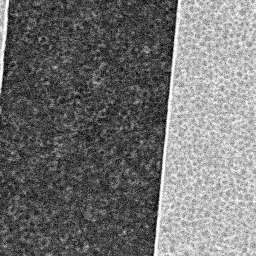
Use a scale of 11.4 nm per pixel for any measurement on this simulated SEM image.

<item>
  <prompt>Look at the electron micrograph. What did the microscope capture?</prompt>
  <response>one or a few lines or trenches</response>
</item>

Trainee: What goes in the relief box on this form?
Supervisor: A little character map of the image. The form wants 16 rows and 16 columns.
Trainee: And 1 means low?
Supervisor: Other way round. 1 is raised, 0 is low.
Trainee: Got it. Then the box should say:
0000000000011111
0000000000011111
0000000000011111
0000000000011111
0000000000011111
0000000000011111
0000000000011111
0000000000011111
0000000000111111
0000000000111111
0000000000111111
0000000000111111
0000000000111111
0000000000111111
0000000000111111
0000000000111111